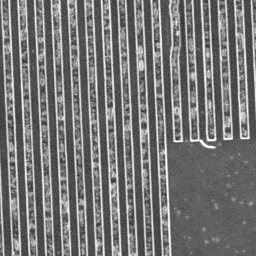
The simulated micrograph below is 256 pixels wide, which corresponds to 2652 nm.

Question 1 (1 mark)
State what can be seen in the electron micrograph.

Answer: parallel lines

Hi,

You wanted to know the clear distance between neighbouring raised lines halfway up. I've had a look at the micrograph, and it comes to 88 nanometres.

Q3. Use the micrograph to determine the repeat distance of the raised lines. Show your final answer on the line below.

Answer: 16.7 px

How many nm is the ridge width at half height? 78.9